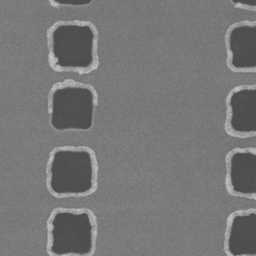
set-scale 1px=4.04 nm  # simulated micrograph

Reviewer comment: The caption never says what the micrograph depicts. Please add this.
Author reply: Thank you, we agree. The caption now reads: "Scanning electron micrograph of holes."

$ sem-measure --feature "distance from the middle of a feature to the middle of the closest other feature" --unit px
62.3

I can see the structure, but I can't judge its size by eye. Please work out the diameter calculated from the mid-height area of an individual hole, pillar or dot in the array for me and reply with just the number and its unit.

178 nanometres